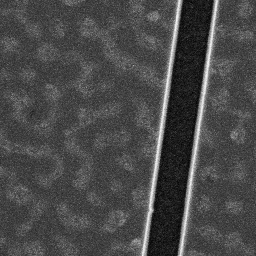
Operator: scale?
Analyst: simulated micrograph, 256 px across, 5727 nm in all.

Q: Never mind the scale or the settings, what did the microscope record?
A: one or a few lines or trenches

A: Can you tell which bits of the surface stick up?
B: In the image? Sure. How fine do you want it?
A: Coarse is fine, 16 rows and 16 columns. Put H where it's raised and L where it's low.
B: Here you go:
HHHHHHHHHHHLLHHH
HHHHHHHHHHHLLHHH
HHHHHHHHHHHLLHHH
HHHHHHHHHHHLLHHH
HHHHHHHHHHHLLHHH
HHHHHHHHHHHLLHHH
HHHHHHHHHHLLLHHH
HHHHHHHHHHLLHHHH
HHHHHHHHHHLLHHHH
HHHHHHHHHHLLHHHH
HHHHHHHHHHLLHHHH
HHHHHHHHHHLLHHHH
HHHHHHHHHHLLHHHH
HHHHHHHHHLLLHHHH
HHHHHHHHHLLHHHHH
HHHHHHHHHLLHHHHH